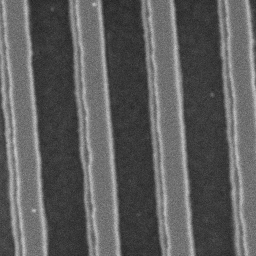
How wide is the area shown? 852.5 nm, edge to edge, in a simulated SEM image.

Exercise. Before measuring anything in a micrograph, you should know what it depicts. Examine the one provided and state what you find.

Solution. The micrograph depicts lines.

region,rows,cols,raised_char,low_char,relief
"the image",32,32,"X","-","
XXX------XXXX-----XXXX-----XXXX-
XXX------XXXX-----XXXX-----XXXX-
XXX------XXXX-----XXXX------XXX-
XXX------XXXX-----XXXX------XXX-
XXXX-----XXXX-----XXXX------XXX-
XXXX-----XXXX-----XXXX------XXX-
XXXX-----XXXX-----XXXX------XXX-
XXXX-----XXXX-----XXXX------XXXX
XXXX-----XXXX------XXX------XXXX
XXXX-----XXXX------XXX------XXXX
XXXX------XXX------XXX------XXXX
XXXX------XXX------XXXX-----XXXX
-XXX------XXX------XXXX-----XXXX
-XXX------XXXX-----XXXX-----XXXX
-XXXX-----XXXX-----XXXX-----XXXX
-XXXX-----XXXX-----XXXX------XXX
-XXXX-----XXXX-----XXXX------XXX
-XXXX-----XXXX-----XXXX------XXX
-XXXX-----XXXX-----XXXX------XXX
-XXXX-----XXXX-----XXXX------XXX
-XXXX-----XXXX-----XXXX------XXX
-XXXX------XXX-----XXXX------XXX
-XXXX------XXX------XXX------XXX
-XXXX------XXX------XXX------XXX
-XXXX------XXXX-----XXX------XXX
-XXXX------XXXX-----XXXX-----XXX
--XXX------XXXX-----XXXX-----XXX
--XXXX-----XXXX-----XXXX-----XXX
--XXXX-----XXXX-----XXXX------XX
--XXXX-----XXXX-----XXXX------XX
--XXXX-----XXXX-----XXXX------XX
--XXXX-----XXXX-----XXXX------XX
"